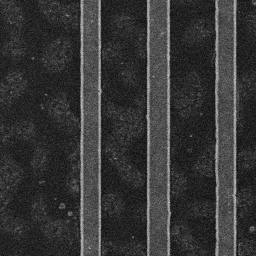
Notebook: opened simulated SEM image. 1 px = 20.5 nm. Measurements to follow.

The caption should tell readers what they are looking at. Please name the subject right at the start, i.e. one or a few lines or trenches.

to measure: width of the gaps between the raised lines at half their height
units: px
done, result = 48.2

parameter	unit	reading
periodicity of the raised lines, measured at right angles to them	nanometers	1390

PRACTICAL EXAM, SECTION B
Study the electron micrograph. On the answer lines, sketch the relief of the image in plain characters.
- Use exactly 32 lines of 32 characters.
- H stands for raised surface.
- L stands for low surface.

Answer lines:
LLLLLLLLLLHHLLLLLLLHHLLLLLLHHLLL
LLLLLLLLLLHHLLLLLLLHHLLLLLLHHLLL
LLLLLLLLLLHHLLLLLLLHHLLLLLLHHLLL
LLLLLLLLLLHHLLLLLLLHHLLLLLLHHLLL
LLLLLLLLLLHHLLLLLLLHHLLLLLLHHLLL
LLLLLLLLLLHHLLLLLLLHHLLLLLLHHLLL
LLLLLLLLLLHHLLLLLLLHHLLLLLLHHLLL
LLLLLLLLLLHHLLLLLLLHHLLLLLLHHLLL
LLLLLLLLLLHHLLLLLLLHHLLLLLLHHLLL
LLLLLLLLLLHHLLLLLLHHHLLLLLLHHLLL
LLLLLLLLLLHHLLLLLLHHHLLLLLLHHLLL
LLLLLLLLLLHHHLLLLLLHHLLLLLLHHLLL
LLLLLLLLLLHHLLLLLLHHHLLLLLLHHLLL
LLLLLLLLLLHHLLLLLLLHHLLLLLLHHLLL
LLLLLLLLLLHHLLLLLLHHHLLLLLLHHLLL
LLLLLLLLLLHHLLLLLLLHHLLLLLLHHLLL
LLLLLLLLLLHHLLLLLLLHHLLLLLLHHLLL
LLLLLLLLLLHHLLLLLLLHHLLLLLLHHLLL
LLLLLLLLLLHHLLLLLLLHHLLLLLLHHLLL
LLLLLLLLLLHHLLLLLLLHHLLLLLLHHLLL
LLLLLLLLLLHHLLLLLLLHHLLLLLLHHLLL
LLLLLLLLLLHHLLLLLLLHHLLLLLLHHLLL
LLLLLLLLLLHHLLLLLLLHHLLLLLLHHLLL
LLLLLLLLLLHHLLLLLLLHHLLLLLLHHLLL
LLLLLLLLLLHHLLLLLLLHHLLLLLLHHLLL
LLLLLLLLLLHHLLLLLLLHHLLLLLLHHLLL
LLLLLLLLLLHHLLLLLLLHHLLLLLLHHLLL
LLLLLLLLLLHHLLLLLLLHHLLLLLLHHLLL
LLLLLLLLLLHHLLLLLLLHHLLLLLLHHLLL
LLLLLLLLLLHHLLLLLLLHHLLLLLLHHLLL
LLLLLLLLLLHHLLLLLLLHHLLLLLLHHLLL
LLLLLLLLLLHHLLLLLLLHHLLLLLLHHLLL